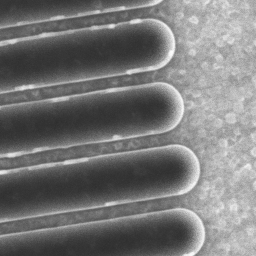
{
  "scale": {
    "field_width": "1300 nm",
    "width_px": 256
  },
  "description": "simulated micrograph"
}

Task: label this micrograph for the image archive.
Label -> one or a few lines or trenches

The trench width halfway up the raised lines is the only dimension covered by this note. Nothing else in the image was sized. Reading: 64.6 nanometers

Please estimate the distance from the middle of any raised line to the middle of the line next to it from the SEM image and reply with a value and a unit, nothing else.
323 nm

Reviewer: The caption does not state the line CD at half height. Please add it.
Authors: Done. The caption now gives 0.258 um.